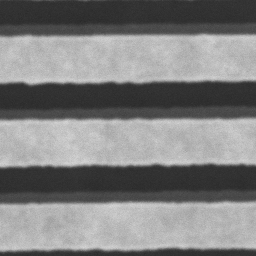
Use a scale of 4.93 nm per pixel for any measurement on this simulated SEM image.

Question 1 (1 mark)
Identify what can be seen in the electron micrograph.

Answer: lines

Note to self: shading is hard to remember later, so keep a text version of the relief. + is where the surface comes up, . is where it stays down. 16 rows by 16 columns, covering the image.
................
...............+
++++++++++++++++
++++++++++++++++
++++++++++++++++
................
................
++++++++++++++++
++++++++++++++++
++++++++++++++++
................
................
++++++++++++++++
++++++++++++++++
++++++++++++++++
++++++++++++++++